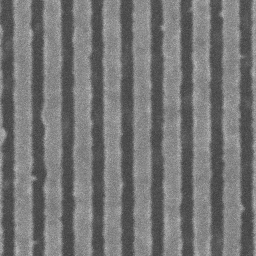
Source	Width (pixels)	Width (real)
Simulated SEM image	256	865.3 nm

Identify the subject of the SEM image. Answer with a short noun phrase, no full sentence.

parallel lines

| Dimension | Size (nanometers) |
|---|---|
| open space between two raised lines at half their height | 46.5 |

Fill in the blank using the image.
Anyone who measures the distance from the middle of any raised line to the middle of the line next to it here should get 101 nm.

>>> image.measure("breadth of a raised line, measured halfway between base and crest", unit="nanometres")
52.8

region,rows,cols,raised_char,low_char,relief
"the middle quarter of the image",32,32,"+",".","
...+++....++++....+++....++++...
...++++...++++....+++....++++...
...++++...++++....+++....++++...
...+++....++++....+++....++++...
...+++....++++....+++....++++...
...+++....++++....++++...++++...
..+++++...++++....+++....++++...
...++++...++++....+++....++++...
...++++...++++....+++....++++...
...++++...++++....++++...++++...
...++++...++++....++++...++++...
...++++...++++....++++...++++...
...+++....++++....+++....++++...
...++++...++++....++++...++++...
...++++...++++....+++....++++...
...++++...++++....++++...++++...
...++++...++++....+++....++++...
...++++...++++....+++....++++...
...++++...++++....+++....++++...
...++++...++++....+++....++++...
...++++...++++....+++....++++...
..+++++...++++....++++...++++...
...++++...++++....+++....++++...
..+++++...++++....+++....++++...
...++++...++++....++++...++++...
...++++...++++....+++....++++...
...++++...++++...++++....++++...
...++++...++++...++++....++++...
...++++...++++....++++...++++...
...++++...++++....++++...++++...
...++++...++++....++++...++++...
..+++++...++++....+++....++++...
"